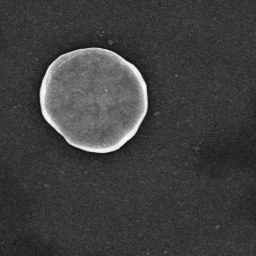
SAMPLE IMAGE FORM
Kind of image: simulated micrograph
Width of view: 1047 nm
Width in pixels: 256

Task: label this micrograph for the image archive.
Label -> raised bodies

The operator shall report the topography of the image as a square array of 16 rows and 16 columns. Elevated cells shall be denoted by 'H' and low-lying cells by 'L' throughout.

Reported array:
LLLLLLLLLLLLLLLL
LLLLLLLLLLLLLLLL
LLLLLLLLLLLLLLLL
LLLLHHHLLLLLLLLL
LLLHHHHHHLLLLLLL
LLLHHHHHHLLLLLLL
LLLHHHHHHLLLLLLL
LLLHHHHHHLLLLLLL
LLLLHHHHLLLLLLLL
LLLLLLLLLLLLLLLL
LLLLLLLLLLLLLLLL
LLLLLLLLLLLLLLLL
LLLLLLLLLLLLLLLL
LLLLLLLLLLLLLLLL
LLLLLLLLLLLLLLLL
LLLLLLLLLLLLLLLL